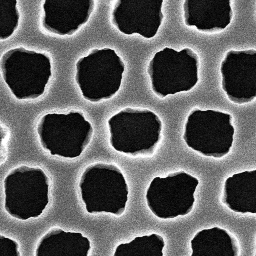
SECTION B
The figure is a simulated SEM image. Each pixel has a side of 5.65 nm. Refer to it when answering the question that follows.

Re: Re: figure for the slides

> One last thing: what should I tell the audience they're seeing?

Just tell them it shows a regular array of holes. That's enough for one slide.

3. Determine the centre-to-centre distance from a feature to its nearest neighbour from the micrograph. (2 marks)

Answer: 0.385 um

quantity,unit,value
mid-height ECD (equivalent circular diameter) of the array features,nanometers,275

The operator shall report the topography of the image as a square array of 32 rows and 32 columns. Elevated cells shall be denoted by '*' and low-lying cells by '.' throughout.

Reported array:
..****......***.....***......***
..****.....***......***......***
..****.....***......***......***
..****....*****.....*****...****
.*****************.*************
********************************
*...********..******....*****...
......****.....****......***....
......****.....****......***....
*.....****.....****......***....
*.....****.....****.....****....
**...*****....******..******....
***********.*****************..*
********************************
******....****......****.....***
*****......***......***......***
*****......***......***......***
*****......***......***......***
******....****.....*****.....***
********..****************..****
********************************
**...******....****************.
*.....****......***......***....
*.....****......***.....****....
*.....****......**......****....
*.....*****.....**......****....
*....******.*..****.....******..
********************************
**************************.*****
******....*********.****.....***
..***......****......***.....***
..***......***......****......**